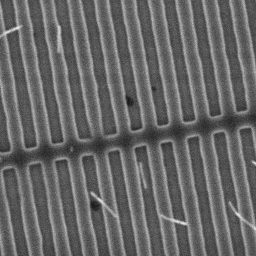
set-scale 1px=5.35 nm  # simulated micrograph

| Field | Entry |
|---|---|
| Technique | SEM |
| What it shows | groups of lines, slits or small figures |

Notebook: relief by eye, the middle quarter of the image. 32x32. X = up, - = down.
----XXX---XXXX---XXXX---XXX----X
X---XXX----XXX---XXXX---XXX----X
X---XXX----XXX----XXX---XXXX---X
X---XXXX---XXXX---XXX----XXX---X
X---XXXX---XXXX---XXX----XXX---X
X---XXXX---XXXX---XXX----XXX----
X----XXX---XXXX---XXXX---XXXX---
XX---XXX----XXX---XXXX---XXXX---
XX---XXX----XXX---XXXX---XXXX---
XX---XXXX---XXX----XXX----XXX---
XX---XXXX---XXXX---XXXX---XXX---
XX---XXXX---XXXX---XXXX---XXX---
XX----XXX----XXX----XXX---XXX---
XX----XXX----XXX----XXX---XXX---
XXX---XXX----XXX----XXX---XXXX--
XXX----XX----XXX----XXXXXXXXXXXX
XXX----XXX---XXXX--XXXXXXXXXXXXX
XXX----XXX---XXXXXXXXXXXXXXXXXXX
XXXX---XXXXXXXXXXXXXXXXXXXXXXXX-
XXXXXXXXXXXXXXXXXXXXXXXXX--XXXX-
XXXXXXXXXXXXXXXXXXX--XXX---XXXX-
XXXXXXXXXXXX--XXXX---XXX----XXX-
XXXXXXXXXXX---XXXX---XXX----XXX-
XXXX----XXX---XXXX---XXX----XXX-
-XXX----XXX----XXX---XXXX---XXXX
-XXXX---XXX----XXX---XXXX---XXXX
-XXXX---XXX----XXX----XXX---XXXX
--XXX---XXXX---XXXX---XXX----XXX
--XXX----XXX---XXXX---XXXX---XXX
--XXX----XXX---XXXX---XXXX---XXX
--XXX----XXX----XXX---XXXX---XXX
--XXXX---XXX----XXX----XXX---XXX